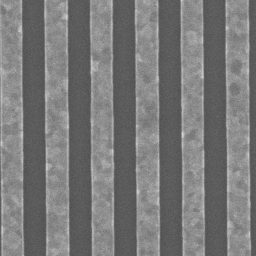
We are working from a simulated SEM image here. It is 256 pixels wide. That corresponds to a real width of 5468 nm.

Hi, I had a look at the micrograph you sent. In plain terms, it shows wiring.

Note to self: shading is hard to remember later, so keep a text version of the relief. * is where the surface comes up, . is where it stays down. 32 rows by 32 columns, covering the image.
***...**...***...***...**...***.
***...**...***...***...**...***.
***...**...***...***...**...***.
***...**...***...***...**...***.
***...**...***...***...**...***.
***...**...***...***...**...***.
***...**...***...***...**...***.
***...**...***...***...**...***.
***...**...***...***...**...***.
***...**...***...***...**...***.
***...**....**...***...**...***.
***...**....**...***...**...***.
***...**...***...***...**...***.
***...**...***...***...**...***.
***...**...***...***...**...***.
***...**...***...***...**...***.
***...**....**...***...**...***.
***...**....**...***...**...***.
***...**....**...***...**...***.
***...**....**...***...**...***.
***...**....**...***...**...***.
***...**....**...***...**...***.
***...**....**...***...**...***.
***...***...**...***...***..***.
***...***...**...***...***..***.
***...***...**...***...***..***.
***...***...**...***...***..***.
***...***...**...***...***..***.
***...***...**...***...***..***.
***...***...**...***...***..***.
***...***...**...***...***...**.
***...***...**...***...***...**.